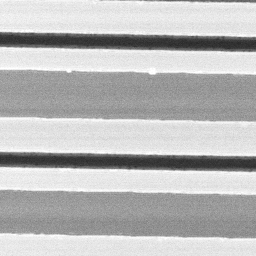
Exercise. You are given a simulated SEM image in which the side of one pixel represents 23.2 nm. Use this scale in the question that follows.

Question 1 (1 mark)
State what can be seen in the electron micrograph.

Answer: lines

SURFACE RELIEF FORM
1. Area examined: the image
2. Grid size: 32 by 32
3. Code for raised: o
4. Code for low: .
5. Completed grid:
oooooooooooooooooooooooooooooooo
oooooooooooooooooooooooooooooooo
oooooooooooooooooooooooooooooooo
oooooooooooooooooooooooooooooooo
...............................o
................................
oooooooooooooooooooooooooooooooo
oooooooooooooooooooooooooooooooo
oooooooooooooooooooooooooooooooo
................................
................................
................................
................................
................................
................................
oooooooooooooooooooooooooooooooo
oooooooooooooooooooooooooooooooo
oooooooooooooooooooooooooooooooo
oooooooooooooooooooooooooooooooo
...........................ooooo
................................
oooooooooooooooooooooooooooooooo
oooooooooooooooooooooooooooooooo
oooooooooooooooooooooooooooooooo
................................
................................
................................
................................
................................
oooooooo........................
oooooooooooooooooooooooooooooooo
oooooooooooooooooooooooooooooooo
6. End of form